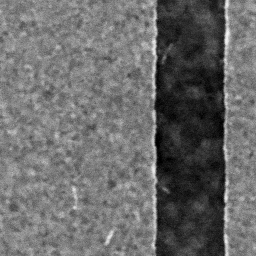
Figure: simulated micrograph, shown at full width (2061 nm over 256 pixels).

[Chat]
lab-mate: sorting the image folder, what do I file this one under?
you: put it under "one or a few lines or trenches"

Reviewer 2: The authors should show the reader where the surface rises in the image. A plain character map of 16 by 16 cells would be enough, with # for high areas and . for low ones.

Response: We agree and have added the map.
##########....##
##########....##
##########....##
##########....##
##########....##
##########....##
##########....##
##########....##
##########....##
##########....##
##########....##
##########....##
##########....##
##########....##
##########....##
##########....##